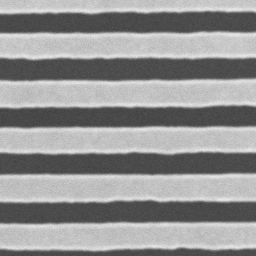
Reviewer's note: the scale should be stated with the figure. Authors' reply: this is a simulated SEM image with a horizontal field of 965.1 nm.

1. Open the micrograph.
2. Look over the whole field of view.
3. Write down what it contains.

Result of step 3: lines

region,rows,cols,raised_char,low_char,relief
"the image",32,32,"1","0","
11111111111111111111111111111111
11111111111111110111011000000001
00000000000000000000000000000000
00000000000000000000000000000000
11111111111111111111111111111111
11111111111111111111111111111111
11111111111111111111111111111111
00000000000000000000000000000000
00000000000000000000000000000000
00000000000000000000000000000000
11111111111111111111111111111111
11111111111111111111111111111111
11111111111111111111111111111111
00000000000000000000000000000000
00000000000000000000000000000000
00000000000000000000000000000000
11111111111111111111111111111111
11111111111111111111111111111111
11111111111111111111111111111111
00000000000000000000000000000000
00000000000000000000000000000000
00000000000000000000000000000000
11111111111111111111111111111111
11111111111111111111111111111111
11111111111111111111111111111111
00000000000000000000000000000000
00000000000000000000000000000000
00000000000000000000000000000000
11111111111111111111111111111111
11111111111111111111111111111111
11111111111111111111111111111111
00000000000000000000000000000000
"